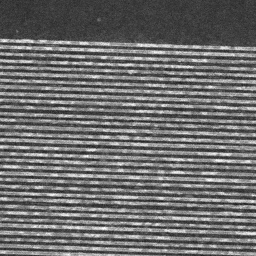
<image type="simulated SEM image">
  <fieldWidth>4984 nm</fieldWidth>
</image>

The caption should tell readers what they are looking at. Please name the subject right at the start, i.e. parallel lines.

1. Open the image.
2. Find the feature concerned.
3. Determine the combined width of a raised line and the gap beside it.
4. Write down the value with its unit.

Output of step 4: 129 nm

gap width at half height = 75.4 nm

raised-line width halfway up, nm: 53.5